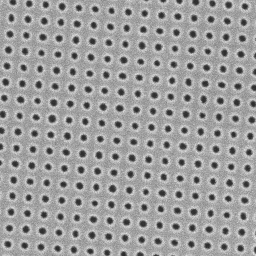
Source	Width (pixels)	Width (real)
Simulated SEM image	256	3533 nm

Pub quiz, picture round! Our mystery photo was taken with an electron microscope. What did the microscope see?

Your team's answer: a regular array of holes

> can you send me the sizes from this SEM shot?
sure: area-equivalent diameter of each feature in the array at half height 0.101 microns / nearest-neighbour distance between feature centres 220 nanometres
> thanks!